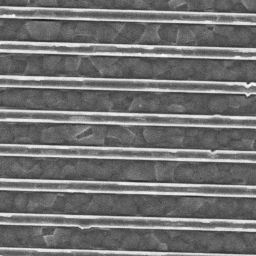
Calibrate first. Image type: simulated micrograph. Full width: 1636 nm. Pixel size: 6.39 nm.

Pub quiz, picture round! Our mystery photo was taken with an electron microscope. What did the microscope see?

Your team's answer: parallel lines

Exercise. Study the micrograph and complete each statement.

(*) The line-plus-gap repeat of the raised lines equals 0.22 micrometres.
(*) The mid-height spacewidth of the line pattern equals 156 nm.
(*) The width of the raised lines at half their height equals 64.7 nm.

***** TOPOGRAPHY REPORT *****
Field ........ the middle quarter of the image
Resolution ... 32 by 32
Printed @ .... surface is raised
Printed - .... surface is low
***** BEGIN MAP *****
--------------------------------
--------------------------------
--------------------------------
--------------------------------
@@@@@@@@@@@@@@@@@@@@@@@@@@@@@@@-
@@@@@@@@@@@@@@@@@@@@@@@@@@@@@@@@
---------------------@@@@@@@@@@@
--------------------------------
--------------------------------
--------------------------------
--------------------------------
--------------------------------
@@@@@@@@@@@@@@@@----------------
@@@@@@@@@@@@@@@@@@@@@@@@@@@@@@@@
@@@@@@@@@@@@@@@@@@@@@@@@@@@@@@@@
--------------------------------
--------------------------------
--------------------------------
--------------------------------
--------------------------------
--------------------------------
@@@@@@@@@@@@@@@@@@@@@@@@@@@@@---
@@@@@@@@@@@@@@@@@@@@@@@@@@@@@@@@
-----------@@@@@@@@@@@@@@@@@@@@@
--------------------------------
--------------------------------
--------------------------------
--------------------------------
--------------------------------
@@@@@@@-------------------------
@@@@@@@@@@@@@@@@@@@@@@@@@@@@@@@@
@@@@@@@@@@@@@@@@@@@@@@@@@@@@@@@@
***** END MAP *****